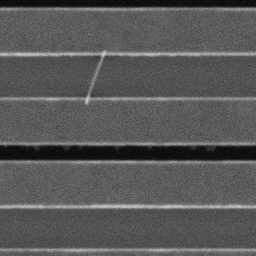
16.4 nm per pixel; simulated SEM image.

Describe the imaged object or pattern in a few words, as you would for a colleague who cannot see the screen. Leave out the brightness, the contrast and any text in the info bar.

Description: lines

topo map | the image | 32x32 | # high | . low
................................
################################
################################
################################
################################
################################
################################
................................
................................
................................
................................
................................
################################
################################
################################
################################
################################
################################
................................
................................
################################
################################
################################
################################
################################
################################
................................
................................
................................
................................
................................
################################